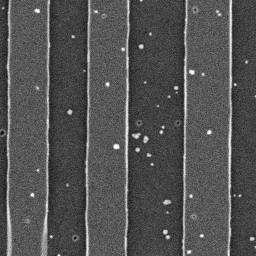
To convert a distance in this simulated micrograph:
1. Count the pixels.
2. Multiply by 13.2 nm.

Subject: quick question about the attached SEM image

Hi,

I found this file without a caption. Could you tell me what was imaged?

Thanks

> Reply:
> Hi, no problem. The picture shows groups of lines, slits or small figures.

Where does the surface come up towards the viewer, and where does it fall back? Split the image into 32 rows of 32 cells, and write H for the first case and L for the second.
LHHHHHLLLLLHHHHHLLLLLLLHHHHHHLLL
LHHHHHLLLLLHHHHHLLLLLLLHHHHHHLLL
LHHHHHLLLLLHHHHHLLLLLLLHHHHHHLLL
LHHHHHLLLLLHHHHHLLLLLLLHHHHHHLLL
LHHHHHLLLLLHHHHHLLLLLLLHHHHHHLLL
LHHHHHLLLLLHHHHHLLLLLLLHHHHHHLLL
LHHHHHLLLLLHHHHHLLLLLLLHHHHHHLLL
LHHHHHLLLLLHHHHHLLLLLLLHHHHHHLLL
LHHHHHLLLLLHHHHHLLLLLLLHHHHHHLLL
LHHHHHLLLLLHHHHHLLLLLLLHHHHHHLLL
LHHHHHLLLLLHHHHHLLLLLLLHHHHHHLLL
LHHHHHLLLLLHHHHHLLLLLLLHHHHHHLLL
LHHHHHLLLLLHHHHHLLLLLLLHHHHHHLLL
LHHHHHLLLLLHHHHHLLLLLLLHHHHHHLLL
LHHHHHLLLLLHHHHHLLLLLLLHHHHHHLLL
LHHHHHLLLLLHHHHHLLLLLLLHHHHHHLLL
LHHHHHLLLLLHHHHHLLLLLLLHHHHHHLLL
LHHHHHLLLLLHHHHHLLLLLLLHHHHHHLLL
LHHHHHLLLLLHHHHHLLLLLLLHHHHHHLLL
LHHHHHLLLLLHHHHHLLLLLLLHHHHHHLLL
LHHHHHLLLLLHHHHHLLLLLLLHHHHHHLLL
LHHHHHLLLLLHHHHHLLLLLLLHHHHHHLLL
LHHHHHLLLLLHHHHHLLLLLLLHHHHHHLLL
LHHHHHLLLLLHHHHHLLLLLLLHHHHHHLLL
LHHHHHLLLLLHHHHHLLLLLLLHHHHHHLLL
LHHHHHLLLLLHHHHHLLLLLLLHHHHHHLLL
LHHHHHLLLLLHHHHHLLLLLLLHHHHHHLLL
LHHHHHLLLLLHHHHHLLLLLLLHHHHHHLLL
LHHHHHLLLLLHHHHHLLLLLLLHHHHHHLLL
LHHHHHLLLLLHHHHHLLLLLLLHHHHHHLLL
LHHHHHLLLLLHHHHHLLLLLLLHHHHHHLLL
LHHHHHLLLLLHHHHHLLLLLLLHHHHHHLLL